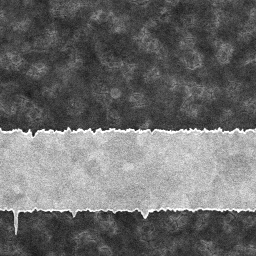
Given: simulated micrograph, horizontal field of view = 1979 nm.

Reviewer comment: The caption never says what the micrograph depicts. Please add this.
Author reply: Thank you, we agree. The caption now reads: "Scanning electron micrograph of one or a few lines or trenches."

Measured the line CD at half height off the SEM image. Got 618 nm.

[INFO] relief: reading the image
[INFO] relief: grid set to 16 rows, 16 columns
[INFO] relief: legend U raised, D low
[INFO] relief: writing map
DDDDDDDDDDDDDDDD
DDDDDDDDDDDDDDDD
DDDDDDDDDDDDDDDD
DDDDDDDDDDDDDDDD
DDDDDDDDDDDDDDDD
DDDDDDDDDDDDDDDD
DDDDDDDDDDDDDDDD
DDDDDDDDDDDDDDDD
UUUUUUUUUUUUUUUU
UUUUUUUUUUUUUUUU
UUUUUUUUUUUUUUUU
UUUUUUUUUUUUUUUU
UUUUUUUUUUUUUUUU
DDDDDDDDDDDDDDDD
DDDDDDDDDDDDDDDD
DDDDDDDDDDDDDDDD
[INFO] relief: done